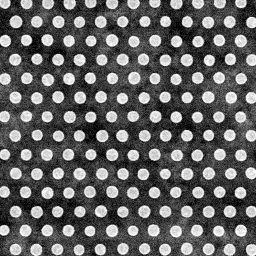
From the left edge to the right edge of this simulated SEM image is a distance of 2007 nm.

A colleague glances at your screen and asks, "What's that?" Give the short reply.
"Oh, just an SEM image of a regular array of raised bodies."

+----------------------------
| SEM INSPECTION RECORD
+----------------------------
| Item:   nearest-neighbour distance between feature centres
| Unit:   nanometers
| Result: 164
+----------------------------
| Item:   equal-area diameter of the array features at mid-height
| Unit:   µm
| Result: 0.0853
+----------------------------